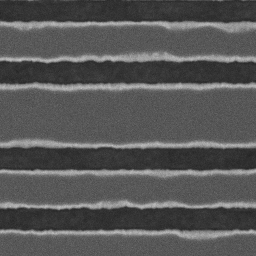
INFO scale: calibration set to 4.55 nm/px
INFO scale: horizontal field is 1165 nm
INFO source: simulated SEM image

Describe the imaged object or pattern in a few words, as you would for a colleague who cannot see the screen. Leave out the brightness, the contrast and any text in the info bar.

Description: lines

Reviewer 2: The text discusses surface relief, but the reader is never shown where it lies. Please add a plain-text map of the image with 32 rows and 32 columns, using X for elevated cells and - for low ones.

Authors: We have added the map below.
--------------------------------
--------------------------------
--------------------------------
XXXXXXXXXXXXXXXXXXXXXXXXXXXXXXXX
XXXXXXXXXXXXXXXXXXXXXXXXXXXXXXXX
XXXXXXXXXXXXXXXXXXXXXXXXXXXXXXXX
XXXXXXXXXXXXXXXXXXXXXXXXXXXXXXXX
XXXXXXXXXXXXXXXXXXX--XXXX-XXXXXX
--------------------------------
--------------------------------
----X-----------------X---XXX--X
XXXXXXXXXXXXXXXXXXXXXXXXXXXXXXXX
XXXXXXXXXXXXXXXXXXXXXXXXXXXXXXXX
XXXXXXXXXXXXXXXXXXXXXXXXXXXXXXXX
XXXXXXXXXXXXXXXXXXXXXXXXXXXXXXXX
XXXXXXXXXXXXXXXXXXXXXXXXXXXXXXXX
XXXXXXXXXXXXXXXXXXXXXXXXXXXXXXXX
XXXXXXXXXXXXXXXXXXXXXXXXXXXXXXXX
--------------------------------
--------------------------------
--------------------------------
XXXXXXXXXXXXXXXXXXXXXXXXXXXXXXXX
XXXXXXXXXXXXXXXXXXXXXXXXXXXXXXXX
XXXXXXXXXXXXXXXXXXXXXXXXXXXXXXXX
XXXXXXXXXXXXXXXXXXXXXXXXXXXXXXXX
XXXXXXXXXXXXXXXXXXXXXXXXXXXXXXXX
--------------------------------
--------------------------------
--------------------------------
XXXXXXXXXXXXXXXXXXXXXXXXXXXXXXXX
XXXXXXXXXXXXXXXXXXXXXXXXXXXXXXXX
XXXXXXXXXXXXXXXXXXXXXXXXXXXXXXXX